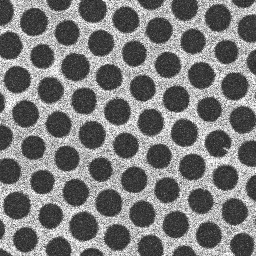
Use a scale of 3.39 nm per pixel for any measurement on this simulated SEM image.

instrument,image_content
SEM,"a regular array of holes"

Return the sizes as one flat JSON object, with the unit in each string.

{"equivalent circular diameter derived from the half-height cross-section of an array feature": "88.8 nm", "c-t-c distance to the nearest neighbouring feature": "116 nm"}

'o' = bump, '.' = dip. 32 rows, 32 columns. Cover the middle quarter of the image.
......oooo...oooo..oooo......ooo
......oo......ooooooooo......oo.
......oo.......ooooooooo....ooo.
o....ooo.......ooo....ooo.ooooo.
oooooooo......ooo.....ooooooooo.
ooooooooo.....oo.......oooo..ooo
ooo....ooo..oooo.......oo......o
oo......ooooooooo......oo......o
oo......oooooooooo....ooo......o
oo......ooo.....ooo.ooooo......o
oo......oo......ooooooooo......o
ooo.....oo.......ooo...ooo....oo
oooo..oooo.......oo.....oooooooo
.ooooooooo......ooo......ooooooo
..oooo..ooo.....oo.......ooo....
..oo.....oooooooooo......oo.....
..oo......ooooooooo.....ooo.....
.ooo......oooo...ooo...oooo.....
oooo......ooo.....ooooooooo.....
oooo......oo......oooooooooo....
.oooo....ooo.......ooo....ooo..o
...ooooooooo.......oo.....oooooo
....ooooooooo.....ooo......ooooo
....oooo..ooooo.ooooo......ooo..
....ooo....oooooooooo......oo...
...ooo......oooooooooo....ooo...
..oooo......ooo.....ooooooooo...
ooooooo.....ooo.....ooooooooo...
ooooooo....ooo.......oooo.oooo..
o....ooooooooo.......ooo....oooo
......oooooooo......ooo......ooo
......oooo..ooo.....ooo......ooo